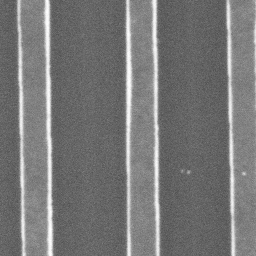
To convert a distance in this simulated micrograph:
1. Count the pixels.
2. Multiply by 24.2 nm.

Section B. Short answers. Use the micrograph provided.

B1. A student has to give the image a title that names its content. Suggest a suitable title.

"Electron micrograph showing lines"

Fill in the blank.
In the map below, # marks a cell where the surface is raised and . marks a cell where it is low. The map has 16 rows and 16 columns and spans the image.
.##.....##....##
.##.....##....##
.##.....##....##
.##.....##....##
.##.....##....##
.##.....##....##
.##.....##....##
.##.....##....##
.##.....##....##
.##.....##....##
.##.....##....##
.##.....##....##
.##.....##....##
.##.....##.....#
.##.....##.....#
.##.....##.....#